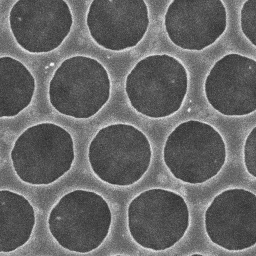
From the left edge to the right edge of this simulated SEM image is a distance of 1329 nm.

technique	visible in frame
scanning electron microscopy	holes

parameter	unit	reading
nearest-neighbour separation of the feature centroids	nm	394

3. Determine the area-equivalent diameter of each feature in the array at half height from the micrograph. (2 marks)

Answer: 0.322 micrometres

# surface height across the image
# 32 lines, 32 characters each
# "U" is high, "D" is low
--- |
UUDDDDDDUUUDDDDDDDUUUDDDDDDDUUUD
UDDDDDDDDUUDDDDDDDDUUDDDDDDDUUDD
UDDDDDDDDUUDDDDDDDDUUDDDDDDDUUDD
UDDDDDDDDUUDDDDDDDUUUDDDDDDDUUDD
UUDDDDDDUUUDDDDDDDUUUDDDDDDDUUUD
UUDDDDDDUUUUDDDDDUUUUUDDDDUUUUUU
UUUUDDUUUUUUUUUUUUUUUUUUUUUUUUUU
DDUUUUUUDDDDUUUUUUDDDDUUUUUDDDDD
DDDUUUUDDDDDDUUUUDDDDDDUUUUDDDDD
DDDDUUUDDDDDDUUUDDDDDDDUUUDDDDDD
DDDDUUDDDDDDDDUUDDDDDDDUUUDDDDDD
DDDDUUDDDDDDDDUUDDDDDDDUUUDDDDDD
DDDDUUDDDDDDDUUUDDDDDDDUUUDDDDDD
DDDUUUUDDDDDDUUUUDDDDDUUUUUDDDDD
DDUUUUUUUDDUUUUUUUDDDUUUUUUUUUUU
UUUUUDDUUUUUUUDUUUUUUUUDDDUUUUUU
UUUDDDDDUUUUDDDDDDUUUUDDDDDUUUUD
UUDDDDDDDUUUDDDDDDDUUDDDDDDDUUUD
UUDDDDDDDUUDDDDDDDDUUDDDDDDDUUUD
UDDDDDDDDUUDDDDDDDDUDDDDDDDDUUUD
UUDDDDDDDUUDDDDDDDDUUDDDDDDDUUUD
UUDDDDDDUUUUDDDDDDUUUDDDDDDUUUUD
UUUDDDDUUUUUUDDDDUUUUUUDDDUUUUUU
UUUUUUUUUUUUUUUUUUUUUUUUUUUUUUUU
DDDUUUUUDDDDDUUUUDDDDDDUUUUDDDDD
DDDDUUUDDDDDDUUUDDDDDDDUUUDDDDDD
DDDDUUDDDDDDDDUUDDDDDDDDUUDDDDDD
DDDDUUDDDDDDDDUUDDDDDDDDUUDDDDDD
DDDDUUDDDDDDDDUUDDDDDDDUUUDDDDDD
DDDDUUUDDDDDDUUUDDDDDDDUUUDDDDDD
DDDUUUUDDDDDDUUUUDDDDDUUUUUDDDDD
UUUUUUUUUUDUUUUUUUUUUUUUUUUUUUUU